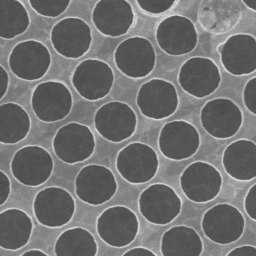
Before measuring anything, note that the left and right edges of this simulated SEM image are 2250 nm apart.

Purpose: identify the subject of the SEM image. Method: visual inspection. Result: a regular array of holes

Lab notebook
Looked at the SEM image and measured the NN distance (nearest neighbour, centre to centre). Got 0.41 µm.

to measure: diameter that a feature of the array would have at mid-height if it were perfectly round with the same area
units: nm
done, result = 360